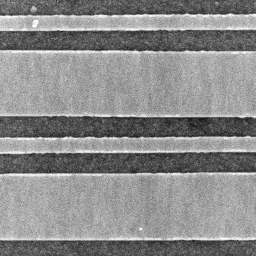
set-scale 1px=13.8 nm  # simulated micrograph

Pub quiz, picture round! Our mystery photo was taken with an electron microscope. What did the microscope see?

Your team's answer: lines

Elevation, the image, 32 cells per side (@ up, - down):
--------------------------------
--------------------------------
@@@@@@@@@@@@@@@@@@@@@@@@@@@@@@@@
@@@@@@@@@@@@@@@@@@@@@@@@@@@@@@@@
--------------------------------
--------------------------------
@@@@@@@@@@@@@@@@@@@----@-@@-----
@@@@@@@@@@@@@@@@@@@@@@@@@@@@@@@@
@@@@@@@@@@@@@@@@@@@@@@@@@@@@@@@@
@@@@@@@@@@@@@@@@@@@@@@@@@@@@@@@@
@@@@@@@@@@@@@@@@@@@@@@@@@@@@@@@@
@@@@@@@@@@@@@@@@@@@@@@@@@@@@@@@@
@@@@@@@@@@@@@@@@@@@@@@@@@@@@@@@@
@@@@@@@@@@@@@@@@@@@@@@@@@@@@@@@@
------@-@@@@@@@@@@@@@@@@@@@@@@@@
--------------------------------
--------------------------------
@@@@@@@@@@@@@@@@@@@@@@@@@@@@@@@@
@@@@@@@@@@@@@@@@@@@@@@@@@@@@@@@@
--------------------------------
--------------------------------
--------------------------------
@@@@@@@@@@@@@@@@@@@@@@@@@@@@@@@@
@@@@@@@@@@@@@@@@@@@@@@@@@@@@@@@@
@@@@@@@@@@@@@@@@@@@@@@@@@@@@@@@@
@@@@@@@@@@@@@@@@@@@@@@@@@@@@@@@@
@@@@@@@@@@@@@@@@@@@@@@@@@@@@@@@@
@@@@@@@@@@@@@@@@@@@@@@@@@@@@@@@@
@@@@@@@@@@@@@@@@@@@@@@@@@@@@@@@@
@@@@@@@@@@@@@@@@@@@@@@@@@@@@@@@@
--------------------------------
--------------------------------